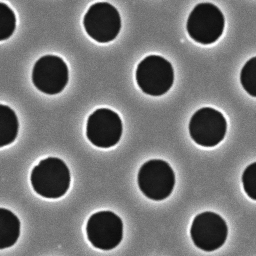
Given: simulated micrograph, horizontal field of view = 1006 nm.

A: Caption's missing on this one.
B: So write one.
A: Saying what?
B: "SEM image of a regular array of holes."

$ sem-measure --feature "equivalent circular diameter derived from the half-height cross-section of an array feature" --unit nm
151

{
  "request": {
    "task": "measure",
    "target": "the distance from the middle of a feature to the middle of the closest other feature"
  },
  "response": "73 px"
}